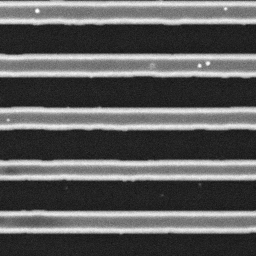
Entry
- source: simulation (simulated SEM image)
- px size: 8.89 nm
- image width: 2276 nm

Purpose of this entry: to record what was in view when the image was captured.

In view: lines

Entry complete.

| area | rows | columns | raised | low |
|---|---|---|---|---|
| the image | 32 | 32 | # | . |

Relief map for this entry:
################################
################################
################################
................................
................................
................................
................................
################################
################################
............................#.#.
................................
................................
................................
................................
################################
################################
................................
................................
................................
................................
################################
################################
................................
................................
................................
................................
....#...........................
################################
################################
................................
................................
................................